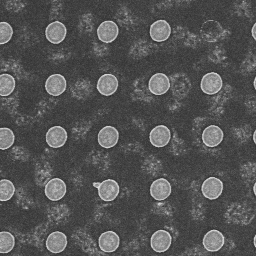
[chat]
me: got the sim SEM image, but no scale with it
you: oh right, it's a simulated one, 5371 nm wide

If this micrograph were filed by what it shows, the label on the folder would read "a regular array of raised bodies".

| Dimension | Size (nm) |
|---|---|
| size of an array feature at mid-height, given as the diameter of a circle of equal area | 436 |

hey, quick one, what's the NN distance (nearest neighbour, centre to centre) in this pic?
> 1080 nm